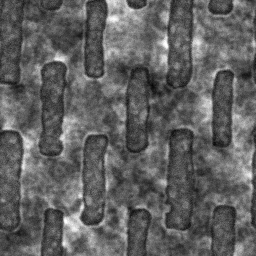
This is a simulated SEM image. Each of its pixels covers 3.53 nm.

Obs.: holes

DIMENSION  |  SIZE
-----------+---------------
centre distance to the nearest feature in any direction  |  288 nm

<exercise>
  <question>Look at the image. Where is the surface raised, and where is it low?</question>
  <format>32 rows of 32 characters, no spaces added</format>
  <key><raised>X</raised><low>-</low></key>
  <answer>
---XX---XXX---XX--XXX---XX---XXX
---XXXXXXXX---XXXXXXX---XX---XXX
---XXXXXXXX--XXXXXXXX---XXXXXXXX
---XXXXXXXX--XXXXXXXX---XXXXXXXX
---XXXXXXXX--XXXXXXXX---XXXXXXXX
---XXXXXXX---XXXXXXXX---XXXXXXXX
---XXXXXXX---XXXXXXXX---XXXXXXXX
---XXXXXXX---XXXXXXXX---XXXXXXXX
---XX---XX---XXXX-XXX---XXXXXXXX
---XX---XXX--XXX---XX---XXX--XXX
--XXX---XXXXXXXX---XX---XXX--XXX
XXXXX---XXXXXXXX---XXXXXXX---XXX
XXXXX---XXXXXXXX---XXXXXXX---XXX
XXXXX---XXXXXXXX---XXXXXXX---XXX
XXXXX---XXXXXXXX---XXXXXXX---XXX
XXXXX---XXXXXXX---XXXXXXXX---XXX
--XXX---XXXXXXXX--XXX---XX---XXX
---XX---XXX---XX---XX---XX---XXX
---XX---XX----XX--XXX---XXXXXXXX
---XXX-XXX---XXXXXXXX---XXXXXXXX
---XXXXXXX---XXXXXXXX---XXXXXXX-
---XXXXXXX---XXXXXXXX---XXXXXXX-
---XXXXXXX---XXXXXXXX---XXXXXXX-
---XXXXXXX---XXXXXXXX---XXXXXXXX
---XXXXXXX---XXXXXXXX---XXXXXXX-
---XXXXXXX---XXXXXXXX---XXXXXXX-
---XXX--XX---XXX---XX---XXX---X-
---XX---XX---XXX---XX---XX---XX-
--XXX---XXXXXXXX---XX---XX----XX
XXXXX---XXXXXXXX---XXXXXXX----XX
XXXXX---XXXXXXXX--XXXXXXXX---XXX
XXXXX---XXXXXXXX--XXXXXXXX---XXX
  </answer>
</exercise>